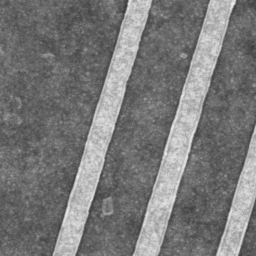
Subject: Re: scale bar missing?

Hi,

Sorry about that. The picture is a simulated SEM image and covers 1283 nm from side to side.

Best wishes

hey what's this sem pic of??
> one or a few lines or trenches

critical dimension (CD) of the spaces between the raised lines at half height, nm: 281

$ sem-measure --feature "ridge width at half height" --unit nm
111